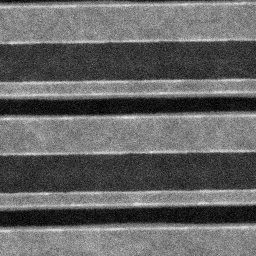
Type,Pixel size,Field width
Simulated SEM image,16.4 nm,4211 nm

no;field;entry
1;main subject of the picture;lines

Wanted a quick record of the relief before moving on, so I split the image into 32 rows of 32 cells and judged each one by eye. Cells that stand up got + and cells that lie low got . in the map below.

.........................+++++++
++++++++++++++++++++++++++++++++
++++++++++++++++++++++++++++++++
++++++++++++++++++++++++++++++++
++++++++++++++++++++++++++++++++
................................
................................
................................
................................
................................
++++++++++++++++++++++++++++++++
++++++++++++++++++++++++++++++++
................................
................................
.........................+++++++
++++++++++++++++++++++++++++++++
++++++++++++++++++++++++++++++++
++++++++++++++++++++++++++++++++
++++++++++++++++++++++++++++++++
................................
................................
................................
................................
................................
++++++++++++++++++++++++++++++++
+++++++++++++++++++++++.........
................................
................................
.....................+++++++++++
++++++++++++++++++++++++++++++++
++++++++++++++++++++++++++++++++
++++++++++++++++++++++++++++++++